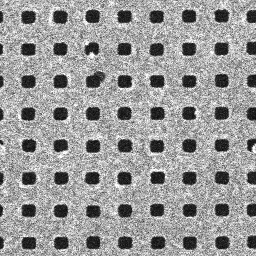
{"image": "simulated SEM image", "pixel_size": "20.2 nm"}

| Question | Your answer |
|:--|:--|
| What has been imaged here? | a regular array of holes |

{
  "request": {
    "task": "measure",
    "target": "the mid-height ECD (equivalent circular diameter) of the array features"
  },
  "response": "305 nm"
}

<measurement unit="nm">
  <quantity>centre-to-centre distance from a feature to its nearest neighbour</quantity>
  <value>645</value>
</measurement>